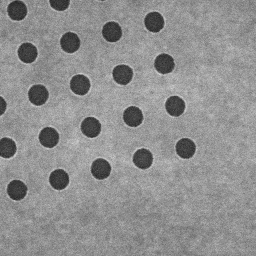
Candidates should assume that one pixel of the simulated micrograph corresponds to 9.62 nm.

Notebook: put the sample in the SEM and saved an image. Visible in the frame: a regular array of holes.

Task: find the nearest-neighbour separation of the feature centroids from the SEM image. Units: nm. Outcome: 415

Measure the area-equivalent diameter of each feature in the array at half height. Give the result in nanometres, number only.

206